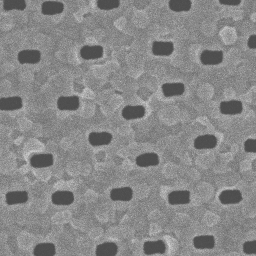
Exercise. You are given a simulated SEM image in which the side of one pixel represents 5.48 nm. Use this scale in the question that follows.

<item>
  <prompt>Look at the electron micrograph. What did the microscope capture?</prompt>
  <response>a regular array of holes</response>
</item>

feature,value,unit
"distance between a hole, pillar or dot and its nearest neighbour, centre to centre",44.1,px